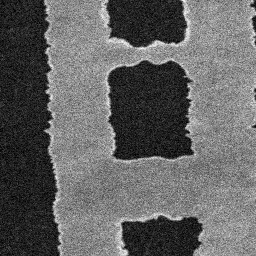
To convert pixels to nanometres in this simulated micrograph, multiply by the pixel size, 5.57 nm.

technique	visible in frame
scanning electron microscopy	one or a few lines or trenches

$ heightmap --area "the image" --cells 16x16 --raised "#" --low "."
...####.....####
...####.....####
...####....#####
...#############
...####.....####
...####.....####
...####.....####
...####.....####
...####.....####
...####.....####
...#############
....############
...#############
...#############
....###......###
....####....####